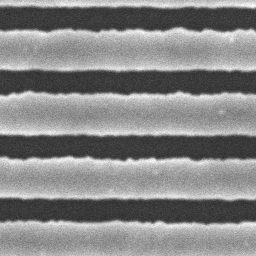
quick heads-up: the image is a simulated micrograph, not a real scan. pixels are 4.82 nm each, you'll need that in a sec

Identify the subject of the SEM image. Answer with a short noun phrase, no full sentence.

lines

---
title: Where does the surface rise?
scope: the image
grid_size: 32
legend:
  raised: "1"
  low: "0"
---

11111111111111111111111111111111
00000000000000000000000000000000
00000000000000000000000000000000
00000000000000000000000000000000
11111111111111111111111111111111
11111111111111111111111111111111
11111111111111111111111111111111
11111111111111111111111111111111
11111111111111111111111111111111
00000000000000000000000000000000
00000000000000000000000000000000
00010000000000000000000000000000
11111111111111111111111111111111
11111111111111111111111111111111
11111111111111111111111111111111
11111111111111111111111111111111
11111111111111111111111111111111
00000000000000000000000000000000
00000000000000000000000000000000
00000000000000000000000000000000
11111111111111111111111111111111
11111111111111111111111111111111
11111111111111111111111111111111
11111111111111111111111111111111
11111111111111111111111111111111
00000000000000000000000000000000
00000000000000000000000000000000
00000000000000000000000000000000
11111111111111111111111111111111
11111111111111111111111111111111
11111111111111111111111111111111
11111111111111111111111111111111